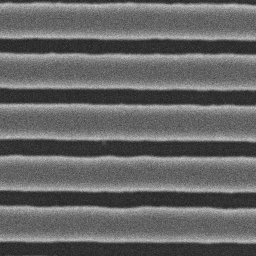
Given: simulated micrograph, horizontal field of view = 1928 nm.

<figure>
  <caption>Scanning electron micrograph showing lines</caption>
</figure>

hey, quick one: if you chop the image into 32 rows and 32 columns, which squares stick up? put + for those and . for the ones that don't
+++++++++++++++++++++++.++..++..
++++++++++++++++++++++++++++++++
++++++++++++++++++++++++++++++++
++++++++++++++++++++++++++++++++
++++++++++++++++++++++++++++++++
................................
................................
++++++++++++++++++++++++++++++++
++++++++++++++++++++++++++++++++
++++++++++++++++++++++++++++++++
++++++++++++++++++++++++++++++++
................................
................................
++++++++++++++++++++++++++++++++
++++++++++++++++++++++++++++++++
++++++++++++++++++++++++++++++++
++++++++++++++++++++++++++++++++
.................+++++++++++++++
................................
.++.............................
++++++++++++++++++++++++++++++++
++++++++++++++++++++++++++++++++
++++++++++++++++++++++++++++++++
++++++++++++++++++++++++++++++++
................................
................................
++++++++++++++++++++++++++++++++
++++++++++++++++++++++++++++++++
++++++++++++++++++++++++++++++++
++++++++++++++++++++++++++++++++
................................
................................